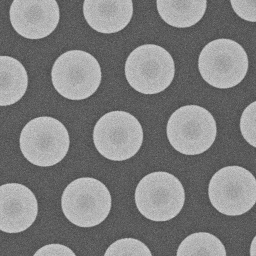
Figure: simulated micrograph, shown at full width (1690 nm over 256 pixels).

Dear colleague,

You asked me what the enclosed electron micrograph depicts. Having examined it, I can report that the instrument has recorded an array of small figures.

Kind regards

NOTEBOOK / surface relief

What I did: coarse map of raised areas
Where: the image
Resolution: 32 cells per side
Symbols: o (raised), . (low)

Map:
..ooooo...ooooooo...oooooo...ooo
.oooooo...ooooooo...oooooo...ooo
.oooooo....ooooo.....oooo......o
..ooooo.....ooo.................
...ooo..........................
..........................oooo..
........ooo......oooo....oooooo.
oo.....ooooo....oooooo...oooooo.
ooo....oooooo...oooooo...oooooo.
ooo...ooooooo...oooooo...oooooo.
ooo....ooooo....ooooo.....oooo..
ooo....ooooo......oo............
oo..............................
.......................oo......o
.............oooo....ooooo....oo
...ooooo....ooooo....oooooo...oo
...ooooo....oooooo...oooooo...oo
...oooooo...oooooo...oooooo....o
...oooooo...ooooo.....oooo......
...ooooo.....oooo...............
....ooo.........................
...........................oooo.
.........ooo......oooo....oooooo
ooo.....ooooo....oooooo...oooooo
oooo....oooooo...oooooo...oooooo
ooooo...oooooo...oooooo....ooooo
ooooo...oooooo....oooo......ooo.
oooo.....oooo......oo...........
ooo.............................
........................ooo.....
..............oooo.....ooooo...o
.....oooo....oooooo...oooooo...o